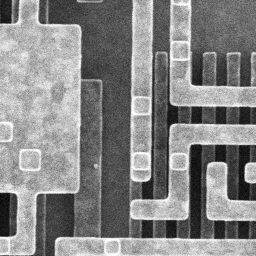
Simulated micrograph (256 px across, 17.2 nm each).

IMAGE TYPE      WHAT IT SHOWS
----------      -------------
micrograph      wiring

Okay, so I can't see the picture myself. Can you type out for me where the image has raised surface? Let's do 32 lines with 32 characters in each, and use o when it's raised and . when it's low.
..ooo............oo..ooo........
..ooo............oo..ooo........
..ooo............oo..ooo........
oooooooooo.......oo..ooo........
oooooooooo.......oo..ooo........
oooooooooo.......oo..ooo........
oooooooooo.......oo..ooo........
oooooooooo.......oo..ooo........
oooooooooo.......oo..ooo........
oooooooooo.......oo..ooo........
oooooooooo.......oo..ooo........
oooooooooo.......oo..ooooooooooo
oooooooooo.......oo..ooooooooooo
oooooooooo.......oo.............
oooooooooo.......oo.............
oooooooooo.......oo.............
oooooooooo.......oo..ooooooooooo
oooooooooo.......oo..ooooooooooo
oooooooooo.......oo..ooo........
oooooooooo......ooo..ooo........
oooooooooo......ooo..ooo..oo...o
oooooooooo......ooo..ooo..oo...o
oooooooooo.......o...ooo..oo...o
oooooooooo...........ooo..oo....
..ooo................ooo..oo....
..oo............oooooooo..oooooo
..oo............ooooooo...oooooo
..oo.......................ooooo
..oo............................
..oo............................
oooo...ooooooooooooooooooooooooo
oooo...ooooooooooooooooooooooooo